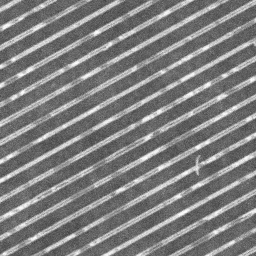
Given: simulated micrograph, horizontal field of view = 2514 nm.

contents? parallel lines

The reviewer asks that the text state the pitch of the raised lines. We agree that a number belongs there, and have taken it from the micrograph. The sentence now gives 0.163 µm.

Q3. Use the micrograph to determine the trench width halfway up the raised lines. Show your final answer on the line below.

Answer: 125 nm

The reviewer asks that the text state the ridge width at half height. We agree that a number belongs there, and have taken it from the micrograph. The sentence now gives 35.5 nanometers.